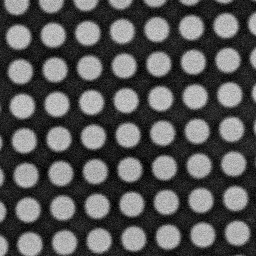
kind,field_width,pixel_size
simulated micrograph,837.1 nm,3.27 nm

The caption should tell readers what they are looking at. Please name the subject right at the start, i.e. an array of small figures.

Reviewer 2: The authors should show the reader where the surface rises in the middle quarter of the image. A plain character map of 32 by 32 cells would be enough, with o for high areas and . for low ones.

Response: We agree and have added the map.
....ooooo...oooooo...oooooo..ooo
o...ooooo...oooooo...ooooo....oo
....ooooo....oooo.....ooo.......
.....ooo........................
................................
................................
..............ooo.....oooo....oo
.....oooo....ooooo...oooooo...oo
o...oooooo...ooooo...oooooo...oo
o...oooooo...ooooo...oooooo...oo
o...oooooo...ooooo....oooo.....o
o....oooo.....ooo......oo.......
......o.........................
................................
................................
.......o......oooo....ooooo....o
o....ooooo...oooooo...oooooo..oo
o....ooooo...oooooo...oooooo..oo
o...oooooo...oooooo...ooooo....o
oo...ooooo....oooo.....oooo.....
o....oooo......oo...............
................................
................................
........................ooo.....
......ooo.....ooooo....ooooo...o
o....ooooo....ooooo...oooooo...o
oo...oooooo...ooooo...oooooo...o
oo...oooooo...ooooo....ooooo....
oo...ooooo....ooooo.....ooo.....
o.....ooo.......................
................................
................................